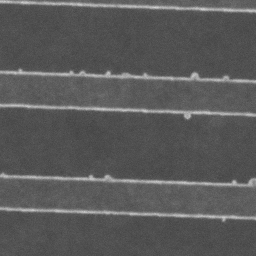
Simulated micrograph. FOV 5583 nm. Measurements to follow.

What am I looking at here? lines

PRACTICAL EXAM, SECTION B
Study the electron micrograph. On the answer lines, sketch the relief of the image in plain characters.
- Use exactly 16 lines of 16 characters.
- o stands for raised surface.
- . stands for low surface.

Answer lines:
..........oooooo
................
................
................
o...............
oooooooooooooooo
oooooooooooooooo
................
................
................
................
oooooooooooooooo
oooooooooooooooo
............oooo
................
................